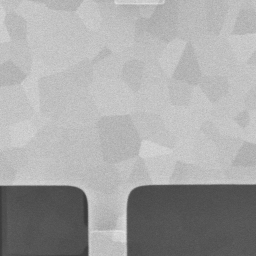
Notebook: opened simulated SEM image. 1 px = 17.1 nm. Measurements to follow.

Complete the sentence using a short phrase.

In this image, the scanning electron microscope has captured wiring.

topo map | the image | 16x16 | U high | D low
UUUUUUUUUUUUUUUU
UUUUUUUUUUUUUUUU
UUUUUUUUUUUUUUUU
UUUUUUUUUUUUUUUU
UUUUUUUUUUUUUUUU
UUUUUUUUUUUUUUUU
UUUUUUUUUUUUUUUU
UUUUUUUUUUUUUUUU
UUUUUUUUUUUUUUUU
UUUUUUUUUUUUUUUU
UUUUUUUUUUUUUUUU
UUUUUUUUUUUUUUUU
DDDDDUUUDDDDDDDD
DDDDDDUUDDDDDDDD
DDDDDDUUDDDDDDDD
DDDDDDUUDDDDDDDD